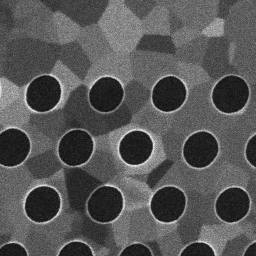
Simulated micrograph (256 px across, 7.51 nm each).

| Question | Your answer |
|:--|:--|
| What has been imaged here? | a regular array of holes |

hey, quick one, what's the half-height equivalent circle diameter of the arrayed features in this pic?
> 272 nm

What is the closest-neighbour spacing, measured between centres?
0.471 um